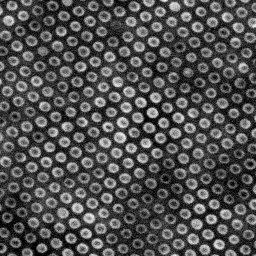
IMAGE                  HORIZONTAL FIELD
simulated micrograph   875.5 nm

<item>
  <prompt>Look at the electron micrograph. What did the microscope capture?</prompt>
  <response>a regular array of raised bodies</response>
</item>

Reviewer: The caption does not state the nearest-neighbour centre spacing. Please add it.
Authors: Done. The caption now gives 15.1 pixels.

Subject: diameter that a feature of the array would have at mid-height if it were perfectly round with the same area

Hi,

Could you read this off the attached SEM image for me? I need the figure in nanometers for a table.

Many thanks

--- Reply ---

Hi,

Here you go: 33.8